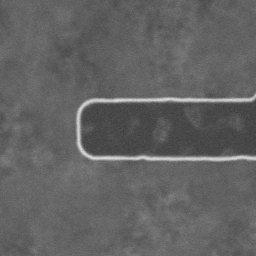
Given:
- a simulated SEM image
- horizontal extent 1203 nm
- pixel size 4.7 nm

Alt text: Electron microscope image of one or a few lines or trenches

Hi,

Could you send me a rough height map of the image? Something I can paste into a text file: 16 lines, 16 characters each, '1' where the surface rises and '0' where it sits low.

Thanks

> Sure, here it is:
0000000000000000
0000000000000000
0000000000000000
0000000000000000
0000000000000000
0000000000000000
0000011111111111
0000011111111111
0000011111111111
0000011111111111
0000000000000000
0000000000000000
0000000000000000
0000000000000000
0000000000000000
0000000000000000